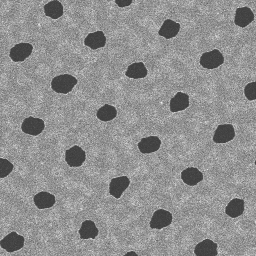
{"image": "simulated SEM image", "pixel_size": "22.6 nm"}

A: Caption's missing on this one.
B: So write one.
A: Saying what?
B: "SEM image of a regular array of holes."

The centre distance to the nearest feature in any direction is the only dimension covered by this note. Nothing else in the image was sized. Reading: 1180 nm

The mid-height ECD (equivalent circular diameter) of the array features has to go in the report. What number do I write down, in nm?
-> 454